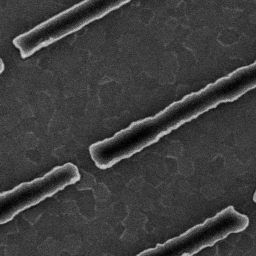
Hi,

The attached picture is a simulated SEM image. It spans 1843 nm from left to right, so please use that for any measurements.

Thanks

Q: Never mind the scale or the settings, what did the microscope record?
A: one or a few lines or trenches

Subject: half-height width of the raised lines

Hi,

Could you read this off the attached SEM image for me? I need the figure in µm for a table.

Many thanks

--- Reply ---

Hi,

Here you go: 0.155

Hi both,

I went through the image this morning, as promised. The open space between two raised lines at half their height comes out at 775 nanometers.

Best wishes